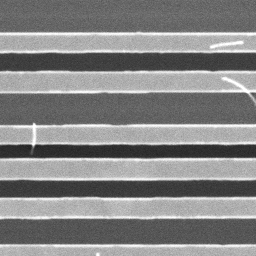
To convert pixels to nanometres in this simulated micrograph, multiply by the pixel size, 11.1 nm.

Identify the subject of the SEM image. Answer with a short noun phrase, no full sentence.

lines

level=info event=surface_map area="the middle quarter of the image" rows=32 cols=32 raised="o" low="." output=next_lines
................................
................................
oooooooooooooooooooooooooooooooo
oooooooooooooooooooooooooooooooo
oooooooooooooooooooooooooooooooo
oooooooooooooooooooooooooooooooo
oooooooooooooooooooooooooooooooo
................................
................................
................................
................................
................................
................................
................................
................................
oooooooooooo....oooooooooooooooo
oooooooooooooooooooooooooooooooo
oooooooooooooooooooooooooooooooo
oooooooooooooooooooooooooooooooo
oooooooooooooooooooooooooooooooo
................................
................................
................................
................................
oooooooooooooooooooooooooooooooo
oooooooooooooooooooooooooooooooo
oooooooooooooooooooooooooooooooo
oooooooooooooooooooooooooooooooo
oooooooooooooooooooooooooooooooo
................................
................................
................................